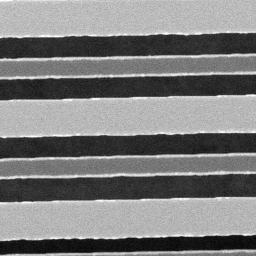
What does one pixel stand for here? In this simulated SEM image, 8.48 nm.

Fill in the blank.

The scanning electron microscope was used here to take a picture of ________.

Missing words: lines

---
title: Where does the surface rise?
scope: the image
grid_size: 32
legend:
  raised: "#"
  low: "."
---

################################
################################
################################
################################
########........................
................................
................................
################################
################################
#################...............
................................
................................
........########################
################################
################################
################################
################################
................................
................................
...................#############
################################
################################
................................
................................
................................
################################
################################
################################
################################
#####################...........
................................
.................###############